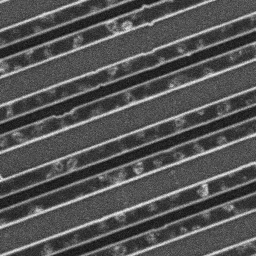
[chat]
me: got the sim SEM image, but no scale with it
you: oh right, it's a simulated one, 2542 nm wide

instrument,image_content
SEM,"parallel lines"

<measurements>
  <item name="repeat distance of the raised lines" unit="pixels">34.8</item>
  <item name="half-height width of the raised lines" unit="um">0.167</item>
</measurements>